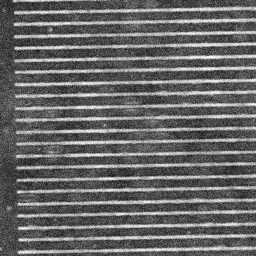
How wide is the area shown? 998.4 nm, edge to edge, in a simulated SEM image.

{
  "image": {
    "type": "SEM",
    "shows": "parallel lines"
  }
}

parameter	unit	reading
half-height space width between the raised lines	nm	39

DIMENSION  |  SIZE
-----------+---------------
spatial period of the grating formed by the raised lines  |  0.0467 micrometres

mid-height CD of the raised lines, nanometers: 6.8